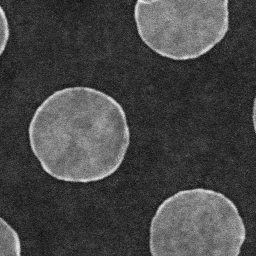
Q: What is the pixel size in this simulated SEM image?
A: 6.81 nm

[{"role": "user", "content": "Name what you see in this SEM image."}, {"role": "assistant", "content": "raised bodies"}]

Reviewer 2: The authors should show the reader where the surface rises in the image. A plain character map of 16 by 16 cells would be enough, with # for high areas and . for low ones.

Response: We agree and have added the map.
.........#####..
.........#####..
.........#####..
..........##....
................
................
...####.........
..######........
..######........
..######........
...####.........
................
...........###..
..........#####.
#........######.
#........######.